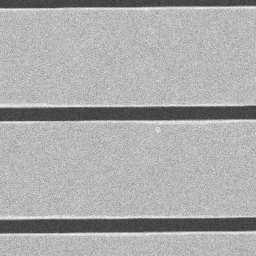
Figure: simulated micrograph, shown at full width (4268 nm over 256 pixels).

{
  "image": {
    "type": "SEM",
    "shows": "lines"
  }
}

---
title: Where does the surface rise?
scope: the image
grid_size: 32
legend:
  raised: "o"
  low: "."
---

................................
oooooooooooooooooooooooooooooooo
oooooooooooooooooooooooooooooooo
oooooooooooooooooooooooooooooooo
oooooooooooooooooooooooooooooooo
oooooooooooooooooooooooooooooooo
oooooooooooooooooooooooooooooooo
oooooooooooooooooooooooooooooooo
oooooooooooooooooooooooooooooooo
oooooooooooooooooooooooooooooooo
oooooooooooooooooooooooooooooooo
oooooooooooooooooooooooooooooooo
oooooooooooooooooooooooooooooooo
................................
................................
oooooooooooooooooooooooooooooooo
oooooooooooooooooooooooooooooooo
oooooooooooooooooooooooooooooooo
oooooooooooooooooooooooooooooooo
oooooooooooooooooooooooooooooooo
oooooooooooooooooooooooooooooooo
oooooooooooooooooooooooooooooooo
oooooooooooooooooooooooooooooooo
oooooooooooooooooooooooooooooooo
oooooooooooooooooooooooooooooooo
oooooooooooooooooooooooooooooooo
oooooooooooooooooooooooooooooooo
................................
................................
oooooooooooooooooooooooooooooooo
oooooooooooooooooooooooooooooooo
oooooooooooooooooooooooooooooooo